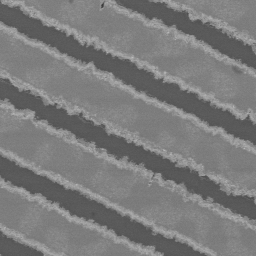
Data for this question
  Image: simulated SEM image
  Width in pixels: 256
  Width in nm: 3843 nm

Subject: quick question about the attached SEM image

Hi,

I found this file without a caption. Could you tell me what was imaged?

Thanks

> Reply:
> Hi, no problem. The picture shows one or a few lines or trenches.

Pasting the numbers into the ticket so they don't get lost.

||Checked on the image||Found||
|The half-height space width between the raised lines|0.389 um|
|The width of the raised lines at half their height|646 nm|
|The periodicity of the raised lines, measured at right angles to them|1.04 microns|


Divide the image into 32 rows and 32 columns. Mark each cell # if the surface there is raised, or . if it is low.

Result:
..############........##########
....############........########
......############........######
#.......############........####
##........############........##
####........#############.......
#######.......#############.....
#########........############...
############.......############.
.############.......############
..#############........#########
.....############........#######
......############.........#####
#.......#############........###
####.......############........#
#####.......#############.......
#######.......##############....
#########........############...
############......#############.
.############........###########
...############.........########
.....#############.......#######
.......#############.......#####
#.........#############......###
####........###########.........
######........############......
########........###########.....
##########........############..
############.......#############
..############........##########
....############........########
......#############.......######